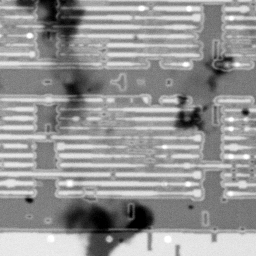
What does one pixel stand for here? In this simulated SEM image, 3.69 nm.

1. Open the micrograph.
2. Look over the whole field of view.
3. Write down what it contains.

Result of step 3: wiring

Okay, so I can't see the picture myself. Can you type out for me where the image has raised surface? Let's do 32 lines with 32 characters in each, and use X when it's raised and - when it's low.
XXXXX--XXXXXXXXXXXXXXXXXXX-XXXXX
XXXXX--XXXXXXXXXXXXXXXXXX---XXXX
XXXXX--XXXXXXXXXXXXXXXXXX---XXXX
XXXXXXXXXXXXXXXXXXXXXXXXX---XXXX
XXXXX--XXXXXXXXXXXXXXXXXX---XXXX
XXXXX--XXXXXXXXXXXXXXXXXX---XXXX
XXXXX--XXXXXXXXXXXXXXXXXX---XXXX
XXXXXXXXXXXXXXXXXXX-XXXXX--XXXXX
-----------XXXXXXX---XXX---XXXX-
--------------------------------
--------------------------------
--------------------------------
XXXXXXXXXXXXXXXXXXX-XXXX---XXXXX
XXXXX--XXXXXXXXXXXXXXXXXX---XXXX
XXXX---XXXXXXXXXXXXXXXXXX---XXXX
XXXX---XXXXXXXXXXXXXXXXXX---XXXX
XXXXX--XXXXXXXXXXXXXXXXXX---XXXX
XXXXXXXXXXXXXXXXXXXXXXXXXX--XXXX
XXXX---XXXXXXXXXXXXXXXXXX---XXXX
XXXX---XXXXXXXXXXXXXXXXXX---XXXX
XXXX---XXXXXXXXXXXXXXXXXXXXXXXXX
XXXXXXXXXXXXXXXXXXXXXXXXXX--XXXX
XXXXX--XXXXXXXXXXXXXXXXXX---XXXX
XXXX---XXXXXXXXXXXXXXXXXX---XXXX
XXXX---XXX--XXXXXXXXXXXXXX--XXXX
--------------------------------
--------------------------------
--------------------------------
--------------------------------
XXXXXXXXXXXXXXXXXXXXXXXXXXXXXXXX
XXXXXXXXXXXXXXXXXXXXXXXXXXXXXXXX
XXXXXXXXXXXXXXXXXXXXXXXXXXXXXXXX